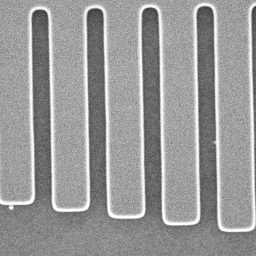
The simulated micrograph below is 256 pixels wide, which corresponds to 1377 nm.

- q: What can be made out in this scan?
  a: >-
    groups of lines, slits or small figures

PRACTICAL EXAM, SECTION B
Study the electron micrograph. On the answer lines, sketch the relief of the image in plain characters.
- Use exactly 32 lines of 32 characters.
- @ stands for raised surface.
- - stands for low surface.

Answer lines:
@@@@@@@@@@@@@@@@@@@@@@@@@@@@@@@@
@@@@--@@@@@--@@@@@--@@@@@--@@@@-
@@@@--@@@@@--@@@@@--@@@@---@@@@-
@@@@--@@@@@--@@@@@--@@@@@--@@@@-
@@@@--@@@@@--@@@@@--@@@@@--@@@@-
@@@@--@@@@@--@@@@@--@@@@@--@@@@-
@@@@--@@@@@--@@@@@--@@@@@--@@@@-
@@@@--@@@@@--@@@@@--@@@@@--@@@@-
@@@@--@@@@@--@@@@@--@@@@@--@@@@-
@@@@--@@@@@--@@@@@--@@@@@--@@@@-
@@@@--@@@@@--@@@@@--@@@@@--@@@@-
@@@@--@@@@@--@@@@@--@@@@@--@@@@-
@@@@--@@@@@--@@@@@--@@@@@--@@@@@
@@@@--@@@@@--@@@@@--@@@@@--@@@@@
@@@@--@@@@@--@@@@@--@@@@@--@@@@@
@@@@---@@@@--@@@@@--@@@@@--@@@@@
@@@@---@@@@--@@@@@--@@@@@--@@@@@
@@@@---@@@@--@@@@@--@@@@@--@@@@@
@@@@---@@@@--@@@@@--@@@@@--@@@@@
@@@@---@@@@--@@@@@--@@@@@--@@@@@
@@@@---@@@@--@@@@@--@@@@@--@@@@@
@@@@---@@@@--@@@@@--@@@@@--@@@@@
@@@@---@@@@--@@@@@--@@@@@--@@@@@
@@@@---@@@@--@@@@@--@@@@@--@@@@@
@@@@---@@@@--@@@@@--@@@@@--@@@@@
-------@@@@---@@@@--@@@@@--@@@@@
--------------@@@@--@@@@@--@@@@@
---------------------@@@@--@@@@@
----------------------------@@@@
--------------------------------
--------------------------------
--------------------------------